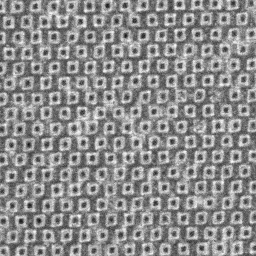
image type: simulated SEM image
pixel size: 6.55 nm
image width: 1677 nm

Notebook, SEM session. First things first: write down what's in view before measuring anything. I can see holes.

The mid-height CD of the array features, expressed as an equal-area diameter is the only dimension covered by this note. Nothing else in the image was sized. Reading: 26.7 nm